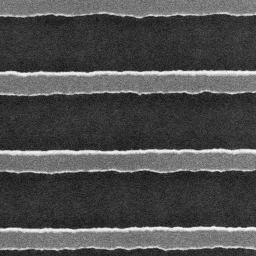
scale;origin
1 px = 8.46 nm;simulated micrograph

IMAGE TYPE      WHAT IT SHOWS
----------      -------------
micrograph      lines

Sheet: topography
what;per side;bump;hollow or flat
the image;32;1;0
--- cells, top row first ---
11111111111111111111111111111111
11111111111111111111111111111111
00000000000000000000000000000000
00000000000000000000000000000000
00000000000000000000000000000000
00000000000000000000000000000000
00000000000000000000000000000000
00000000000000000000000000000000
00000000000000000000000000000000
11111111111111111111111111111111
11111111111111111111111111111111
11111111111111111111111110111111
00000000000000000000000000000000
00000000000000000000000000000000
00000000000000000000000000000000
00000000000000000000000000000000
00000000000000000000000000000000
00000000000000000000000000000000
00000000000000000000000000000000
11111111111111111111111111111111
11111111111111111111111111111111
00101111000000000000100000000000
00000000000000000000000000000000
00000000000000000000000000000000
00000000000000000000000000000000
00000000000000000000000000000000
00000000000000000000000000000000
00000000000000000000000000000000
00000000000000000000000000100000
11111111111111111111111111111111
11111111111111111111111111111111
00000000000000000000000000000000